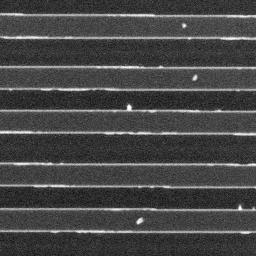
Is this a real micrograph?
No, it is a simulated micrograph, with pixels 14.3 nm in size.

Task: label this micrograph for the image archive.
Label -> lines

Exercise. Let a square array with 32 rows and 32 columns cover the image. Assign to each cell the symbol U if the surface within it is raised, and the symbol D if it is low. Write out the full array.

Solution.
DDDDDDDDDDDDDDDDDDDDDDDDDDDDDDDD
DDDDDDDDDDDDDDDDDDDDDDDDDDDDDDDD
UUUUUUUUUUUUUUUUUUUUUUUUUUUUUUUU
UUUUUUUUUUUUUUUUUUUUUUUUUUUUUUUU
UUUUUUUUUUUUUUUUUUUUUUUUUUUUUUUU
DDDDDDDDDDDDDDDDDDDDDDDDDDDDDDDD
DDDDDDDDDDDDDDDDDDDDDDDDDDDDDDDD
DDDDDDDDDDDDDDDDDDDDDDDDDDDDDDDD
UUUUUUUUUUUUUUUUUUUUUUUUUUUUUUUU
UUUUUUUUUUUUUUUUUUUUUUUUUUUUUUUU
UUUUUUUUUUUUUUUUUUUUUUUUUUUUUUUU
DDDDDDDDDDDDDDDDDDDDDDDDDDDDDDDD
DDDDDDDDDDDDDDDDDDDDDDDDDDDDDDDD
DDDDDDDDDDDDDDDDDDDDDDDDDDDDDDDD
UUUUUUUUUUUUUUUUUUUUUUUUUUUUUUUU
UUUUUUUUUUUUUUUUUUUUUUUUUUUUUUUU
UUUUUUUUUUUUUUUUUUUUUUUUUUUUUUUU
DDDDDDDDDDDDDDDDDDDDDDDDDDDDDDDD
DDDDDDDDDDDDDDDDDDDDDDDDDDDDDDDD
DDDDDDDDDDDDDDDDDDDDDDDDDDDDDDDD
UUUUUUUUDDDDDDDDDDDDDDDDDDDDDDDD
UUUUUUUUUUUUUUUUUUUUUUUUUUUUUUUU
UUUUUUUUUUUUUUUUUUUUUUUUUUUUUUUU
DDDDDDDDDDDDDDDDDDDDDDDDDDDDDDDD
DDDDDDDDDDDDDDDDDDDDDDDDDDDDDDDD
DDDDDDDDDDDDDDDDDDDDDDDDDDDDDDDD
UUUUUUUUUUUUUUUUUUUUUUUUUUUUUUUU
UUUUUUUUUUUUUUUUUUUUUUUUUUUUUUUU
UUUUUUUUUUUUUUUUUUUUUUUUUUUUUUUU
DDDDDDDDDDDDDDDDDDDDDDDDDDDDDDDD
DDDDDDDDDDDDDDDDDDDDDDDDDDDDDDDD
DDDDDDDDDDDDDDDDDDDDDDDDDDDDDDDD